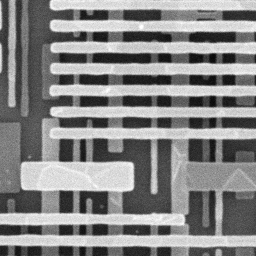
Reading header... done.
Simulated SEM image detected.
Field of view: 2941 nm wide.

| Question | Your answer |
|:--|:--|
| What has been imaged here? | wiring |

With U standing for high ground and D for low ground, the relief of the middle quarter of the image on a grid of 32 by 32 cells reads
UUUUUUUUUUUUUUUUUUUUUUUUUUUUUUUU
UUUUUUUUUUUUUUUUUUUUUUUUUUUUUUUU
DDDDDDDUUDDDDUUDDDDUUUUDUUUDDDDD
DDDDDDDDDDDDDDDDDDDDDDDDDDDDDDDD
DDDDDDDDDDDDDDDDDDDDDDDDDDDDDDDD
UUUUUUUUUUDUUUUUUUUUUUUUUUUUDDUU
UUUUUUUUUUUUUUUUUUUUUUUUUUUUUUUU
UUUUUUUUUUUUUUUUUUUUUUUUUUUUUUUU
DDDDDDDDDDDDDDDDDDDDDDDDDDDDDDDD
DDDDDDDDDDDDDDDDDDDDDDDDDDDDDDDD
DDDDDDDDDDDDDDDDDDDDDDDDDDDDDDDD
UUUUUUUUUUUUUUUUUUUUUUUUUUUUUUUU
UUUUUUUUUUUUUUUUUUUUUUUUUUUUUUUU
DDDDDDDDDDDDDDDDDDDDDDDDDDDDDDDD
DDDDDDDDDDDDDDDDDDDDDDDDDDDDDDDD
DDDDDDDDDDDDDDDDDDDDDDDDDDDDDDDD
UUUUUUUUUUUUUUUUUUUUUUUUUUUUUUUU
UUUUUUUUUUUUUUUUUUUUUUUUUUUUUUUU
DDDDDDDDDDDDDDDDDDDDDDDDDDDDDDDD
DDDDDDDDDDDDDDDDDDDDDDDDDDDDDDDD
DDDDDDDDDDDDDDDDDDDDDDDDDDDDDDDD
DDDDDDDDDDDDDDDDDDDDDDDDDDDDDDDD
DDDDDDDDDDDDDDDDDDDDDDDDDDDDDDDD
DDDDDDDDDDDDDDDDDDDDDDDDDDDDDDDD
DDDDDDDDDDDDDDDDDDDDDDDDDDDDDDDD
UUUUUUUUUUUUUUUUUDDDDDDDDDDDDDUU
UUUUUUUUUUUUUUUUUDDDDDDDDDDDDDUU
UUUUUUUUUUUUUUUUUDDDDDDDDDDDDDUU
UUUUUUUUUUUUUUUUUDDDDDDDDDDDDDUU
UUUUUUUUUUUUUUUUUDDDDDDDDDDDDDUU
UUUUUUUUUUUUUUUUUDDDDDDDDDDDDDUU
DDDDDUUUUUUUUUUUUDDDDDDDDDDDDDDU